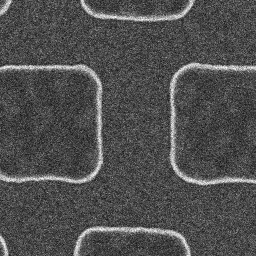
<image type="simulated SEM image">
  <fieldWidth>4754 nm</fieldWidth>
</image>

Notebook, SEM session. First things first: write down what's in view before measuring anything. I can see raised bodies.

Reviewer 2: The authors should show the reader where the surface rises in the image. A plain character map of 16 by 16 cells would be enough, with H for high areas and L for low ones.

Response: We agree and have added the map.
LLLLLHHHHHHHLLLL
LLLLLLLLLLLLLLLL
LLLLLLLLLLLLLLLL
LLLLLLLLLLLLLLLL
HHHHHHLLLLLHHHHH
HHHHHHLLLLLHHHHH
HHHHHHLLLLLHHHHH
HHHHHHLLLLLHHHHH
HHHHHHLLLLLHHHHH
HHHHHHLLLLLHHHHH
HHHHHHLLLLLHHHHH
LLLLLLLLLLLLLLLL
LLLLLLLLLLLLLLLL
LLLLLLLLLLLLLLLL
LLLLLHHHHHHLLLLL
LLLLLHHHHHHHLLLL